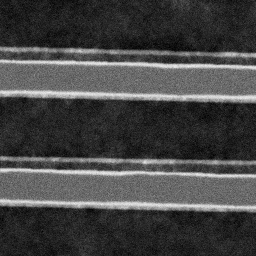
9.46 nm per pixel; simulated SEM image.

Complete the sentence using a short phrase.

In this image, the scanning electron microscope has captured lines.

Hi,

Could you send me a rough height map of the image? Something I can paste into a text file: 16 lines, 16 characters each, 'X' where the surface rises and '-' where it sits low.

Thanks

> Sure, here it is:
----------------
----------------
----------------
----------------
XXXXXXXXXXXXXXXX
XXXXXXXXXXXXXXXX
----------------
----------------
----------------
----------------
----------------
XXXXXXXXXXXXXXXX
XXXXXXXXXXXXXXXX
----------------
----------------
----------------